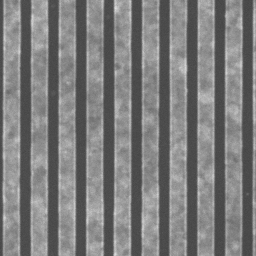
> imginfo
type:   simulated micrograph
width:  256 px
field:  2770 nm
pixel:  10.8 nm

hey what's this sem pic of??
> parallel lines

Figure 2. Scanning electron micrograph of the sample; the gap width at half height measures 0.131 µm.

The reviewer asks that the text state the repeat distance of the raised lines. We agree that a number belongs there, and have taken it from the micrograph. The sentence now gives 0.301 µm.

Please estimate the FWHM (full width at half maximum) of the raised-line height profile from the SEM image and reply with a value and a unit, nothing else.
162 nm